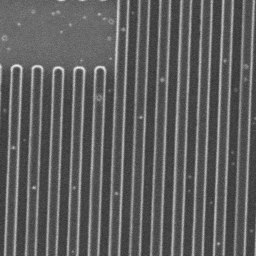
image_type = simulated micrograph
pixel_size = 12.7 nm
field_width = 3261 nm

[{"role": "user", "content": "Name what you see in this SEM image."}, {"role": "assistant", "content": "parallel lines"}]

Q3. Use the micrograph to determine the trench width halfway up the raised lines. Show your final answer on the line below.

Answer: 137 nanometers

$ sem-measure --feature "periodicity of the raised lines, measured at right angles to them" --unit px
20.9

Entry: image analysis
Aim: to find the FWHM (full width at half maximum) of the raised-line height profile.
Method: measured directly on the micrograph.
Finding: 137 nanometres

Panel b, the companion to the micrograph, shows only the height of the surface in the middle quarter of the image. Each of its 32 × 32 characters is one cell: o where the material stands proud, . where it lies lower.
.............oo...ooo...oo...oo.
...oo...oo...oo...ooo...oo...oo.
...oo...oo...oo...ooo..ooo...oo.
...oo...oo...oo...ooo..ooo...oo.
...oo...oo...oo...oo...ooo...oo.
..ooo...oo...oo...oo...ooo...oo.
..ooo...oo...oo...oo...ooo..ooo.
..ooo...oo...oo...oo...ooo..ooo.
..ooo...oo...oo...oo...ooo..ooo.
..ooo...oo...oo...oo...ooo..ooo.
..ooo..ooo...oo...oo...ooo..ooo.
..ooo..ooo...oo...oo...ooo..ooo.
..ooo..ooo...oo...oo...ooo..ooo.
..ooo..ooo...oo...oo...ooo..ooo.
..ooo..ooo..ooo...oo...ooo..ooo.
..ooo..ooo..ooo...oo...oo...ooo.
..ooo..ooo..ooo...oo...oo...ooo.
..ooo..ooo..ooo...oo...oo...ooo.
..oo...ooo..ooo...oo...oo...ooo.
..oo...ooo..ooo...oo...oo...oo..
..oo...ooo..ooo...oo...oo...oo..
..oo...ooo..ooo...oo...oo...oo..
..oo...ooo..ooo...oo...oo...oo..
..oo...oo...ooo...oo...oo...oo..
..oo...oo...ooo...oo...oo...oo..
..oo...oo...ooo..ooo...oo...oo..
..oo...oo...ooo..ooo...oo...oo..
..oo...oo...oo...ooo...oo...oo..
..oo...oo...oo...ooo...oo...oo..
..oo...oo...oo...ooo..ooo...oo..
..oo...oo...oo...ooo..ooo...oo..
..oo...oo...oo...oo...ooo...oo..